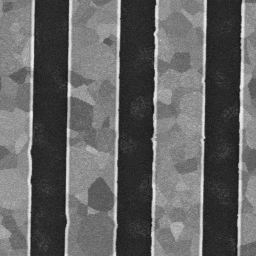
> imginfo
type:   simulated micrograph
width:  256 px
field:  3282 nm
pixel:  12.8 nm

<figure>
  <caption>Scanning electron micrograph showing one or a few lines or trenches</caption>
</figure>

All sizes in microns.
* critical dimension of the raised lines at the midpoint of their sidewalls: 0.628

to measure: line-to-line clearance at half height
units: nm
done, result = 474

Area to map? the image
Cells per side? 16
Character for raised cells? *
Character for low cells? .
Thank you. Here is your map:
**..***...***..*
**..***...***..*
**..***...***..*
**..***...***..*
**..***...***..*
**..***...***..*
**..***...***..*
**..***...***..*
**..***...***..*
**..***...***..*
**..***...***..*
**..***...***..*
**..***...***..*
**..***...***..*
**..***...***..*
**..***...***..*